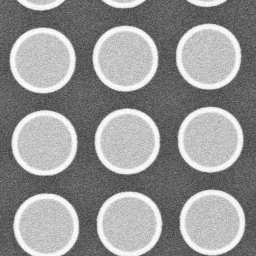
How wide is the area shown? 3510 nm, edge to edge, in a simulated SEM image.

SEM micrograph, an array of small figures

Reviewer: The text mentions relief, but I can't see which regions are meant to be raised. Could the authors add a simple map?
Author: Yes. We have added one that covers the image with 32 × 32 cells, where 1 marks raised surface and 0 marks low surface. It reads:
00011111000001111000000011100000
00000000000000000000000000000000
00000000000000000000000000000000
00000100000000111000000011110000
00011111000001111110000111111000
00111111100011111110001111111100
01111111100011111111001111111100
01111111100011111111001111111100
01111111100011111111001111111100
00111111100011111110000111111000
00011111000001111100000011110000
00001100000000000000000000000000
00000000000000000000000000000000
00000000000000000000000000100000
00011111000001111100000011111000
00111111100001111110000111111100
00111111100011111111001111111100
00111111110011111111001111111100
00111111110011111111001111111100
00111111100011111111000111111100
00111111100001111110000011111000
00001110000000111000000000100000
00000000000000000000000000000000
00000000000000000000000000000000
00001110000000111100000011111000
00011111100001111110000111111100
00111111100011111111000111111100
00111111110011111111000111111110
00111111110011111111000111111110
00111111110011111111000111111100
00111111100001111110000011111100
00011111000000111100000001110000